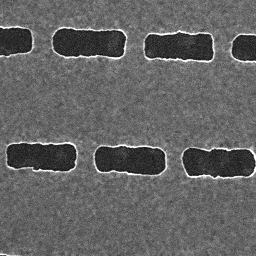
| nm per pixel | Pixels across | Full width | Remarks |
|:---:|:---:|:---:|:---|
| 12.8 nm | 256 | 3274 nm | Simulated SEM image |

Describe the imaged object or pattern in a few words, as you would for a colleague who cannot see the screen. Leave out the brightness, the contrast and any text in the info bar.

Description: holes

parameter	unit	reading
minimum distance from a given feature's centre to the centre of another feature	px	89.7